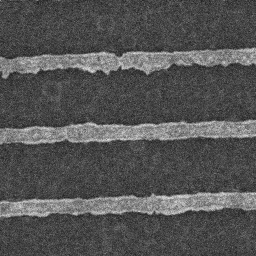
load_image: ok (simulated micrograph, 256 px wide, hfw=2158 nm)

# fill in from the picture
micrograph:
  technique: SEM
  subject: one or a few lines or trenches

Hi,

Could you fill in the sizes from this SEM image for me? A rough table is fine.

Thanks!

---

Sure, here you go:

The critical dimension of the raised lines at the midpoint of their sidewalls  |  120 nm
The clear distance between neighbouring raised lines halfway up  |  490 nm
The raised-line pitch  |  72 px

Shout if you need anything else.